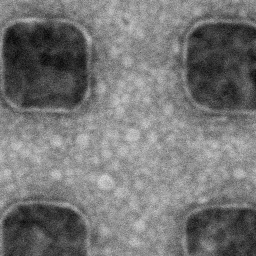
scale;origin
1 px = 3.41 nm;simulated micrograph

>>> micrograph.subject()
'raised bodies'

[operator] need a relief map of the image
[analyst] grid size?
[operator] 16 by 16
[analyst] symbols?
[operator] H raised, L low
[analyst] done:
LLLLLLLLLLLLLLLL
LHHHHLLLLLLLHHHH
HHHHHHLLLLLLHHHH
HHHHHHLLLLLHHHHH
HHHHHHLLLLLHHHHH
HHHHHHLLLLLLHHHH
LHHHHLLLLLLLHHHH
LLLLLLLLLLLLLLLL
LLLLLLLLLLLLLLLL
LLLLLLLLLLLLLLLL
LLLLLLLLLLLLLLLL
LLLLLLLLLLLLLLLL
LLLLLLLLLLLLLLLL
HHHHHLLLLLLLHHHH
HHHHHHLLLLLHHHHH
HHHHHHLLLLLHHHHH